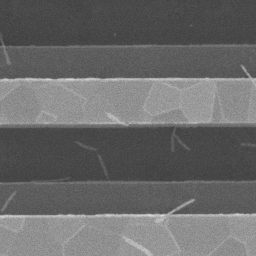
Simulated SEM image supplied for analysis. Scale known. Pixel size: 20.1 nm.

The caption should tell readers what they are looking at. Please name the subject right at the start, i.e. lines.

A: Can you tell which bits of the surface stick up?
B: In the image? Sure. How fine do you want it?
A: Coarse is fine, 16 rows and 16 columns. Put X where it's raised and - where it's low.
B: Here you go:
----------------
----------------
----------------
XXXXXXXXXXXXXXXX
XXXXXXXXXXXXXXXX
XXXXXXXXXXXXXXXX
XXXXXXXXXXXXXXXX
XXXXXXXXXXXXXXXX
----------------
----------------
----------------
XXXXXXXXXXXXXXXX
XXXXXXXXXXXXXXXX
XXXXXXXXXXXXXXXX
XXXXXXXXXXXXXXXX
XXXXXXXXXXXXXXXX